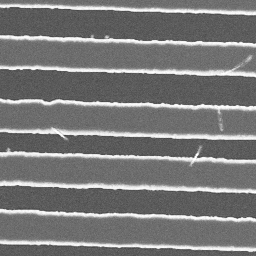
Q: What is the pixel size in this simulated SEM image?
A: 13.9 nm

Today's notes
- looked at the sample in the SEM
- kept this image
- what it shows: lines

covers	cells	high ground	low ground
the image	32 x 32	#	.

################################
...........................#####
................................
................................
................................
###############################.
################################
################################
################################
................................
................................
................................
................................
################################
################################
################################
.##.############################
................................
................................
##############..................
################################
################################
################################
...............#################
................................
................................
#####...........................
################################
################################
################################
.........#######################
................................